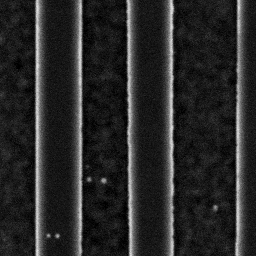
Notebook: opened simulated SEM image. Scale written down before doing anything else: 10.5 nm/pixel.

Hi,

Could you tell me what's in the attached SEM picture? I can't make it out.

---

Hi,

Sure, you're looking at lines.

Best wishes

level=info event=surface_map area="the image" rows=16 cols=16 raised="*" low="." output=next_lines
..***...***....*
..***...***....*
..***...***....*
..***...***....*
..***...***....*
..***...***....*
..***...***....*
..***...***....*
..***...***....*
..***...***....*
..***...***....*
..***...***....*
..***...***....*
..***...***....*
..***...***....*
..***...***....*